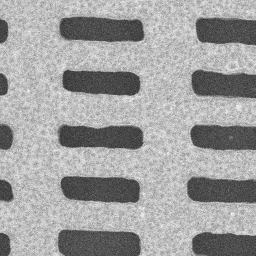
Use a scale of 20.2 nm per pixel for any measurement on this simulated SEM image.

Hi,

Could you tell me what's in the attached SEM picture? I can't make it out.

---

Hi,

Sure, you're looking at holes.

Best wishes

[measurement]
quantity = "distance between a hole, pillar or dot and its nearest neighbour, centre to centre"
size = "1060 nm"